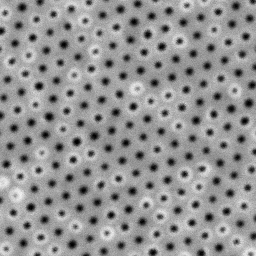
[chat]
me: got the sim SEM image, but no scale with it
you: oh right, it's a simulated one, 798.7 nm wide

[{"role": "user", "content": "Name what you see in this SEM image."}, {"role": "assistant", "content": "a regular array of holes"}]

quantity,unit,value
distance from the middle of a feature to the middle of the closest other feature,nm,56.7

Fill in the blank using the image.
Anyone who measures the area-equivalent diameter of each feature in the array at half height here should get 23.4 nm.